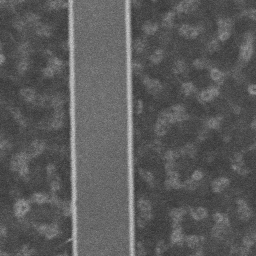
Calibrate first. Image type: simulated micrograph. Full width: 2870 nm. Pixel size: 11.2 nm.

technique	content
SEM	one or a few lines or trenches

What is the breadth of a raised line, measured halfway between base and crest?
632 nanometers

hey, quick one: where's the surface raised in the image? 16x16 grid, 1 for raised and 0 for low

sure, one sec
0000111100000000
0000111100000000
0000011100000000
0000011100000000
0000011100000000
0000011100000000
0000011100000000
0000011100000000
0000011100000000
0000011100000000
0000011100000000
0000011100000000
0000011100000000
0000011100000000
0000011100000000
0000011100000000